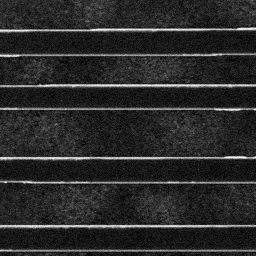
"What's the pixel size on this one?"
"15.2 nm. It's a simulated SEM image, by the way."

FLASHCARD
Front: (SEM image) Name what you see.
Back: lines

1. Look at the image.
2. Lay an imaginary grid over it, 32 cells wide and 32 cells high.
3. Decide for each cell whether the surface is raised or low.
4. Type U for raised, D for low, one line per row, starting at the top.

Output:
DDDDDDDDDDDDDDDDDDDDDDDDDDDDDDDD
DDDDDDDDDDDDDDDDDDDDDDDDDDDDDDDD
DDDDDDDDDDDDDDDDDDDDDDDDDDDDDDDD
DDDDDDDDDDDDDDDDDDDDDDDDDDDDDDDD
UUUUUUUUUUUUUUUUUUUUUUUUUUUUUUUU
UUUUUUUUUUUUUUUUUUUUUUUUUUUUUUUU
UUUUUUUUUUUUUUUUUUUUUUUUUUUUUUUU
DDDDDDDDDDDDDDDDDDDDDDDDDDDDDDDD
DDDDDDDDDDDDDDDDDDDDDDDDDDDDDDDD
DDDDDDDDDDDDDDDDDDDDDDDDDDDDDDDD
DDDDDDDDDDDDDDDDDDDDDDDDDDDDDDDD
UUUUUUUUUUUUUUUUUUUUUUUUUUUUUUUU
UUUUUUUUUUUUUUUUUUUUUUUUUUUUUUUU
UUUUUUUUUUUUUUUUUUUUUUUUUUUUUUUU
DDDDDDDDDDDDDDDDDDDDDDDDDDDDDDDD
DDDDDDDDDDDDDDDDDDDDDDDDDDDDDDDD
DDDDDDDDDDDDDDDDDDDDDDDDDDDDDDDD
DDDDDDDDDDDDDDDDDDDDDDDDDDDDDDDD
DDDDDDDDDDDDDDDDDDDDDDDDDDDDDDDD
DDDDDDDDDDDDDDDDDDDDDDDDDDDDDDDD
UUUUUUUUUUUUUUUUUUUUUUUUUUUUUUUU
UUUUUUUUUUUUUUUUUUUUUUUUUUUUUUUU
UUUUUUUUUUUUUUUUUUUUUUUUUUUUUUUU
DDDDDDDDDDDDDDDDDDDDDDDDDDDDDDDD
DDDDDDDDDDDDDDDDDDDDDDDDDDDDDDDD
DDDDDDDDDDDDDDDDDDDDDDDDDDDDDDDD
DDDDDDDDDDDDDDDDDDDDDDDDDDDDDDDD
DDDDDDDDDDDDDDDDDDDDDDDDDDDDDDDD
UUUUUUUUUUUUUUUUUUUUUUUUUUUUUUUU
UUUUUUUUUUUUUUUUUUUUUUUUUUUUUUUU
UUUUUUUUUUUUUUUUUUUUUUUUUUUUUUUU
DDDDDDDDDDDDDDDDDDDDDDDDDDDDDDDD